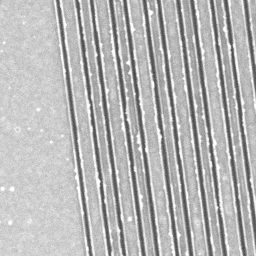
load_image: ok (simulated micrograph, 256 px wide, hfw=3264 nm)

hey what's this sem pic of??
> parallel lines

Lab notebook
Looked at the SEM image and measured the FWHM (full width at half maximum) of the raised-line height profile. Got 91.7 nm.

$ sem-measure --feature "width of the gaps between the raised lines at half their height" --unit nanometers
136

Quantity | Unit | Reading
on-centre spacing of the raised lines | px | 16.8